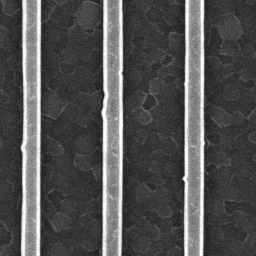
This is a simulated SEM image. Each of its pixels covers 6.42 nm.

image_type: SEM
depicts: one or a few lines or trenches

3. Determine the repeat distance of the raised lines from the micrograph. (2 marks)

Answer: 522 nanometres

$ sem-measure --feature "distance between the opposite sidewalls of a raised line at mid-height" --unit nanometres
108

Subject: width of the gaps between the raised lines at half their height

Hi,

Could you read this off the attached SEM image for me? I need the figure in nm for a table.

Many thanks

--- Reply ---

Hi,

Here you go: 414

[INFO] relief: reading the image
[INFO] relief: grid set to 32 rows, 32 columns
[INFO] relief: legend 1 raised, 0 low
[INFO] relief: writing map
00011000000001100000000110000000
00011000000001100000000110000000
00011000000001100000000110000000
00011000000001100000000110000000
00011000000001100000000110000000
00011000000001100000000110000000
00011000000001100000000110000000
00011000000001100000000110000000
00011000000001100000000110000000
00011000000001100000000110000000
00011000000001100000000110000000
00011000000001100000000110000000
00011000000001100000000110000000
00011000000001100000000110000000
00011000000001100000000110000000
00011000000001100000000110000000
00011000000001100000000110000000
00011000000001100000000110000000
00011000000001100000000110000000
00011000000001100000000110000000
00011000000001100000000110000000
00011000000001100000000110000000
00011000000001100000000110000000
00011000000001100000000110000000
00011000000001100000000110000000
00011000000001100000000110000000
00011000000001100000000110000000
00011000000001100000000110000000
00011000000001100000000110000000
00011000000001100000000110000000
00011000000001100000000110000000
00011000000001100000000110000000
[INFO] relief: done